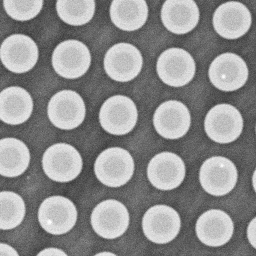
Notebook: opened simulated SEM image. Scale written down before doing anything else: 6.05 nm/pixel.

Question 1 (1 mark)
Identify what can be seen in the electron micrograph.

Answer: an array of small figures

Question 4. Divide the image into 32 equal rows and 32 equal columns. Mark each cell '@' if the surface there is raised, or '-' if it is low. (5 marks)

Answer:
-@@@@--@@@@@--@@@@---@@@----@@--
-@@@@--@@@@@--@@@@--@@@@@--@@@@-
--@-----@@@---@@@@--@@@@@--@@@@-
---------------@@----@@@---@@@@-
-@@-------------------------@@--
@@@@----@@-----@----------------
@@@@@--@@@@--@@@@----@@---------
@@@@@--@@@@--@@@@@--@@@@---@@@--
-@@@---@@@@--@@@@@--@@@@--@@@@@-
--------@@----@@@---@@@@--@@@@@-
---------------------@@----@@@--
@@@-----@-----------------------
@@@@--@@@@---@@@----------------
@@@@--@@@@@--@@@@---@@@----@@---
@@@@--@@@@@-@@@@@--@@@@@--@@@@--
-------@@@---@@@@--@@@@@--@@@@--
--------------@@----@@@---@@@@--
@@-------------------------@@---
@@@---@@@-----------------------
@@@@-@@@@@--@@@@----@@----------
@@@@-@@@@@--@@@@@--@@@@--@@@@---
@@@---@@@@--@@@@@-@@@@@--@@@@@--
-------@@---@@@@---@@@@--@@@@@--
--------------------@@---@@@@---
@@------------------------------
@@@--@@@@---@@@-----------------
@@@--@@@@@--@@@@--@@@@----@@----
@@@--@@@@--@@@@@--@@@@---@@@@---
@@---@@@@---@@@@--@@@@---@@@@--@
-------------@@---@@@@---@@@@--@
--------------------------@@---@
@@---@@@------------------------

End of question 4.